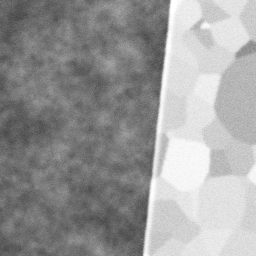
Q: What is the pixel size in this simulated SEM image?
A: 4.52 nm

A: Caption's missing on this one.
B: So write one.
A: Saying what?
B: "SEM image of one or a few lines or trenches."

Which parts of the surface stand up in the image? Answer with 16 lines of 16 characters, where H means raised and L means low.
LLLLLLLLLLLHHHHH
LLLLLLLLLLLHHHHH
LLLLLLLLLLLHHHHH
LLLLLLLLLLHHHHHH
LLLLLLLLLLHHHHHH
LLLLLLLLLLHHHHHH
LLLLLLLLLLHHHHHH
LLLLLLLLLLHHHHHH
LLLLLLLLLLHHHHHH
LLLLLLLLLLHHHHHH
LLLLLLLLLLHHHHHH
LLLLLLLLLLHHHHHH
LLLLLLLLLHHHHHHH
LLLLLLLLLHHHHHHH
LLLLLLLLLHHHHHHH
LLLLLLLLLHHHHHHH